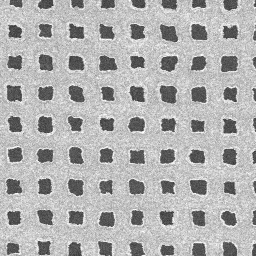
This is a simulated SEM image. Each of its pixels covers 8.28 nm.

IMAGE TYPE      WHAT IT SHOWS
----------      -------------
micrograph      a regular array of holes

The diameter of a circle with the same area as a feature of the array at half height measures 132 nanometres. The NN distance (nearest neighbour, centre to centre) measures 0.249 um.